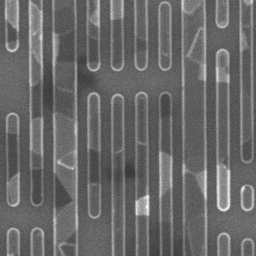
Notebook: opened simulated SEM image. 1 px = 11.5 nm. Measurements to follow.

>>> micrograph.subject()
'groups of lines, slits or small figures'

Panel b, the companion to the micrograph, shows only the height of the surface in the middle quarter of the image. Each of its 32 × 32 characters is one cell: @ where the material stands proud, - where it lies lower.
@@@---@@@---@@@---@@@---@@@---@@
@@@---------------------------@@
@@@---------------------------@@
@@@---------------------------@@
@@@---------------------------@@
@@@---------------------------@@
@@@---------------------------@@
@@@----@----------@@----@@----@@
@@@---@@@---@@@---@@@---@@@---@@
@@@---@@@---@@@---@@@---@@@---@@
@@@---@@@---@@@---@@@---@@@---@@
@@@---@@@---@@@---@@@---@@@---@@
@@@---@@@---@@@---@@@---@@@---@@
@@@---@@@---@@@---@@@---@@@---@@
@@@---@@@---@@@---@@@---@@@---@@
@@@---@@@---@@@---@@@---@@@---@@
@@@---@@@---@@@---@@@---@@@---@@
@@@---@@@---@@@---@@@---@@@---@@
@@@---@@@---@@@---@@@---@@@---@@
@@@---@@@---@@@---@@@---@@@---@@
@@@---@@@---@@@---@@@---@@@---@@
@@@---@@@---@@@---@@@---@@@---@@
@@@---@@@---@@@---@@@---@@@---@@
@@@---@@@---@@@---@@@---@@@---@@
@@@---@@@---@@@---@@@---@@@---@@
@@@---@@@---@@@---@@@---@@@---@@
@@@---@@@---@@@---@@@---@@@---@@
@@@---@@@---@@@---@@@---@@@---@@
@@@---@@@---@@@---@@@---@@@---@@
@@@---@@@---@@@---@@@---@@@---@@
@@@---@@@---@@@---@@@---@@@---@@
@@@---@@@---@@@---@@@---@@@---@@